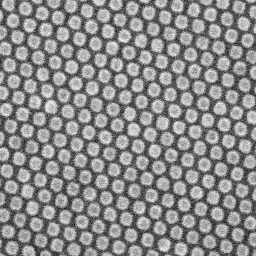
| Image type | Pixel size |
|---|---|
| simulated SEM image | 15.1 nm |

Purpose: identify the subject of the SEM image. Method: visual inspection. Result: a regular array of raised bodies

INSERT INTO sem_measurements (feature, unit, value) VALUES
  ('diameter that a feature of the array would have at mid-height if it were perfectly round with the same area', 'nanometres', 171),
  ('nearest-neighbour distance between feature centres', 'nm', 254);